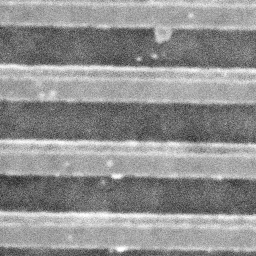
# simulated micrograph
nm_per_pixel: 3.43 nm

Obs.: lines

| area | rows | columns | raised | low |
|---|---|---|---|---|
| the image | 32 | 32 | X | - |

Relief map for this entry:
XXXXXXXXXXXXXXXXXXXXXXXXXXXXXXXX
XXXXXXXXXXXXXXXXXXXXXXXXXXXXXXXX
XXXXXXXXXXXXXXXXXXXXXXXXXXXXXXXX
---------------------------XXXXX
--------------------------------
--------------------------------
--------------------------------
--------------------------------
XXXXXXX-XXXXX-------------------
XXXXXXXXXXXXXXXXXXXXXXXXXXXXXXXX
XXXXXXXXXXXXXXXXXXXXXXXXXXXXXXXX
XXXXXXXXXXXXXXXXXXXXXXXXXXXXXXXX
--------X-XXXXXXXXXXXXXXXXXXXXXX
--------------------------------
--------------------------------
--------------------------------
--------------------------------
--------------------------------
XXXXXXXXXXXXXXXXXXXXXXXXXXXXXXXX
XXXXXXXXXXXXXXXXXXXXXXXXXXXXXXXX
XXXXXXXXXXXXXXXXXXXXXXXXXXXXXXXX
XXXXXXXXXXXXXXXXXXXXXXXXXXXXXXXX
--------------------------------
--------------------------------
--------------------------------
--------------------------------
--------------------------------
XXXXXXXXXXXXXXXXXXXXXXXXXXXXXXXX
XXXXXXXXXXXXXXXXXXXXXXXXXXXXXXXX
XXXXXXXXXXXXXXXXXXXXXXXXXXXXXXXX
XXXXXXXXXXXXXXXXXXXXXXXXXXXXXXXX
--------------------------------